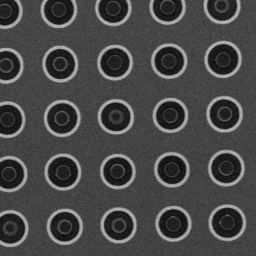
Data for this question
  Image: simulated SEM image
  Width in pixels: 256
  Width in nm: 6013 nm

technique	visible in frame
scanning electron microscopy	an array of small figures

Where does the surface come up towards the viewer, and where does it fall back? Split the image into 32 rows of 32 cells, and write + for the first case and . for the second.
..+++....+++....+++....+++....++
...++....+++....+++....+++....++
..++++...++++...++++..+++++..+++
++++++++++++++++++++++++++++++++
++++++++++++++++++++++++++++++++
+++++++++++++++++++++++++++..+++
..++++...++++...+++....+++....++
...+++...+++....+++....+++....++
...+++...+++....+++....+++....++
..++++...++++..+++++..++++++++++
++++++++++++++++++++++++++++++++
++++++++++++++++++++++++++++++++
+++++++++++++++++++++++++++..+++
..++++...++++...++++...+++....++
...+++....++.....++....+++....++
...+++....+++...++++...+++....++
..+++++..+++++.+++++++++++++++++
++++++++++++++++++++++++++++++++
++++++++++++++++++++++++++++++++
+++++++.++++++++++++..+++++...++
...+++....+++...++++...+++....++
...+++....+++....++....+++....++
...+++....+++...++++...++++...++
..+++++.++++++++++++++++++++++++
++++++++++++++++++++++++++++++++
++++++++++++++++++++++++++++++++
+++++++..+++++..++++...++++...++
...+++....+++....+++....++....++
...+++....+++....+++....++....++
...+++....+++...++++...++++...++
..++++++++++++++++++++++++++++++
++++++++++++++++++++++++++++++++